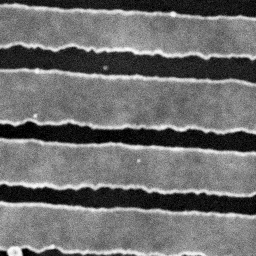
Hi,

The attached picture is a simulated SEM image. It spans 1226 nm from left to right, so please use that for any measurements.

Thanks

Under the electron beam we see lines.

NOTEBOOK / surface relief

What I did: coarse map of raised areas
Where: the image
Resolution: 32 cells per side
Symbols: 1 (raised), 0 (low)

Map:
00000000000000000000000000000000
11111111111111111100000000000000
11111111111111111111111111111111
11111111111111111111111111111111
11111111111111111111111111111111
11111111111111111111111111111111
00000000000010001111111111111111
00000000000000000000000000000000
00000000000000000000000000000000
11111111111111111100000000000000
11111111111111111111111111111111
11111111111111111111111111111111
11111111111111111111111111111111
11111111111111111111111111111111
11111111111111111111111111111111
01100111011111111111111111111111
00000000000000000000000000011001
11111000000000000000000000000000
11111111111111111111111000000000
11111111111111111111111111111111
11111111111111111111111111111111
11111111111111111111111111111111
11111111111111111111111111111111
00000011110100111111111111111111
00000000000000000000000000000110
11111100000000000000000000000000
11111111111111111111110110000000
11111111111111111111111111111111
11111111111111111111111111111111
11111111111111111111111111111111
11111111111111111111111111111111
01101000111111111111111111111111